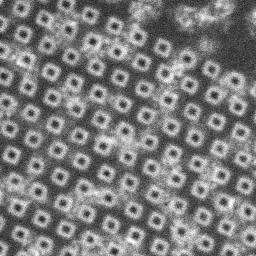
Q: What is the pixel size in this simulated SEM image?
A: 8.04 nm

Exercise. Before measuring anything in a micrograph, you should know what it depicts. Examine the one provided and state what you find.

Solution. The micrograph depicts holes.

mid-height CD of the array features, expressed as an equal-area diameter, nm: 48.9